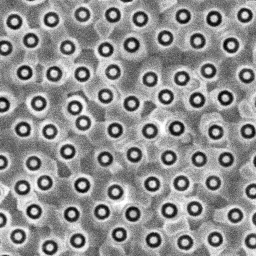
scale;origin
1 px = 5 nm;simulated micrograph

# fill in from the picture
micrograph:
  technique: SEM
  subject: a regular array of ring-shaped grooves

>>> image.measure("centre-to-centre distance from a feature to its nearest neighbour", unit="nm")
136